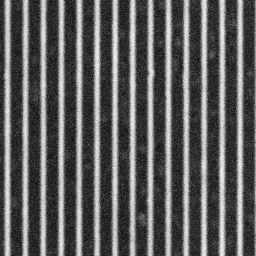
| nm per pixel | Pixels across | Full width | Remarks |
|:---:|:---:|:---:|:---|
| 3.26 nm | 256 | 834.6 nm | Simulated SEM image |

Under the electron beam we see parallel lines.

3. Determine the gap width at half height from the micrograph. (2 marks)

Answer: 13.3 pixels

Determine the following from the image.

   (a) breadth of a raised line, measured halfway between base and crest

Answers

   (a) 0.0155 µm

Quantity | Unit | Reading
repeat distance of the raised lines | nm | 58.2